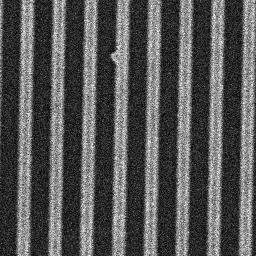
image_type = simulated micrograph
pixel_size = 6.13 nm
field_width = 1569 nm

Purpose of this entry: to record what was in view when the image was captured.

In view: parallel lines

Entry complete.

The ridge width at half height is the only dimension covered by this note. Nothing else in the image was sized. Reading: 61.3 nm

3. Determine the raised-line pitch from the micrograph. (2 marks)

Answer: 0.194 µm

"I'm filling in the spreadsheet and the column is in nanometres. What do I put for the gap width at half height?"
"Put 135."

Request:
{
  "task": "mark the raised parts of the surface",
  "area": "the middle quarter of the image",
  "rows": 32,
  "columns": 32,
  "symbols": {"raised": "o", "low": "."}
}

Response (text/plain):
.....ooo.....ooo.....oo......oo.
.....ooo.....ooo.....oo......oo.
.....ooo.....ooo.....oo......oo.
.....ooo.....ooo.....oo......oo.
.....ooo.....ooo.....oo......oo.
.....ooo.....ooo.....oo......oo.
.....ooo.....ooo.....oo......oo.
.....ooo.....ooo.....oo......oo.
.....ooo.....ooo.....oo......oo.
.....ooo.....ooo.....oo......oo.
.....oo......oo......oo......oo.
.....oo......oo......oo......oo.
.....oo......oo......oo......oo.
.....oo......oo......oo......oo.
.....oo......oo......oo......oo.
.....oo......oo......oo......oo.
.....oo......oo......oo......oo.
.....oo......oo......oo......oo.
.....oo......oo......oo......oo.
.....oo......oo......oo......oo.
.....oo......oo......oo......oo.
.....oo......oo......oo......oo.
.....oo......oo......oo......oo.
.....oo......oo......oo......oo.
.....oo......oo......oo......oo.
.....oo......oo......oo......oo.
.....oo......oo......oo......oo.
.....oo......oo......oo......oo.
.....oo......oo......oo......oo.
.....oo......oo......oo......oo.
.....oo......oo......oo......oo.
.....oo......oo......oo......oo.